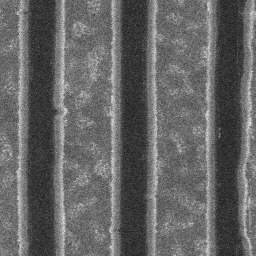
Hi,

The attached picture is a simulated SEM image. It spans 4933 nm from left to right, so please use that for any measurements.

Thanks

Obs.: one or a few lines or trenches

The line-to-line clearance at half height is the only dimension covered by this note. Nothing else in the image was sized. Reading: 687 nanometers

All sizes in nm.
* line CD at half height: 1120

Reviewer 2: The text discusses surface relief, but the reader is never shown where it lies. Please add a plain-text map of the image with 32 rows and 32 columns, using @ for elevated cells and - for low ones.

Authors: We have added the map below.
@@@-----@@@@@@-----@@@@@@@-----@
@@@-----@@@@@@-----@@@@@@@@----@
@@@-----@@@@@@-----@@@@@@@-----@
@@@-----@@@@@@@----@@@@@@@-----@
@@@-----@@@@@@@----@@@@@@@-----@
@@@----@@@@@@@@----@@@@@@@-----@
@@@----@@@@@@@@----@@@@@@@-----@
@@@----@@@@@@@@----@@@@@@@-----@
@@@----@@@@@@@@----@@@@@@@-----@
@@@----@@@@@@@@----@@@@@@@-----@
@@@----@@@@@@@@----@@@@@@@-----@
@@@----@@@@@@@-----@@@@@@@-----@
@@@----@@@@@@@@----@@@@@@@-----@
@@@----@@@@@@@@----@@@@@@@-----@
@@@-----@@@@@@@----@@@@@@@-----@
@@@----@@@@@@@@----@@@@@@@-----@
@@@----@@@@@@@@----@@@@@@@-----@
@@@----@@@@@@@@----@@@@@@@-----@
@@@----@@@@@@@@----@@@@@@@-----@
@@@----@@@@@@@@----@@@@@@@-----@
@@@----@@@@@@@@----@@@@@@@----@@
@@@----@@@@@@@@----@@@@@@@----@@
@@@----@@@@@@@@----@@@@@@@----@@
@@@----@@@@@@@-----@@@@@@@----@@
@@@----@@@@@@@-----@@@@@@@----@@
@@@----@@@@@@@-----@@@@@@@----@@
@@@-----@@@@@@-----@@@@@@@----@@
@@@-----@@@@@@-----@@@@@@@----@@
@@@-----@@@@@@-----@@@@@@@----@@
@@@-----@@@@@@-----@@@@@@@-----@
@@@-----@@@@@@-----@@@@@@@-----@
@@@-----@@@@@@-----@@@@@@@-----@